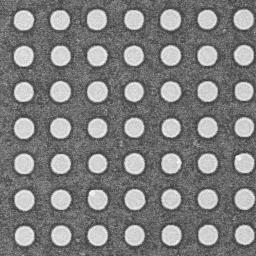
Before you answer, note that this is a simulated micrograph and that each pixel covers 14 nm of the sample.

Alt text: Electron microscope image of a regular array of raised bodies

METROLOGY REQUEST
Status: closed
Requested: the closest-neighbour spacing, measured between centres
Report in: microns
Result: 0.499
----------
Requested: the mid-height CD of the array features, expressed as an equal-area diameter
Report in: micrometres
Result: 0.265